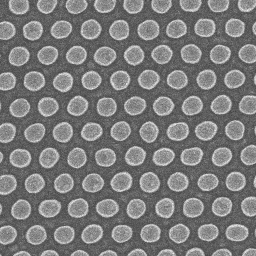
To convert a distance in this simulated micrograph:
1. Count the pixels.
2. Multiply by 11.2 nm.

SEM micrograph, a regular array of raised bodies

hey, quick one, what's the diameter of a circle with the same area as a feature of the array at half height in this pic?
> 210 nm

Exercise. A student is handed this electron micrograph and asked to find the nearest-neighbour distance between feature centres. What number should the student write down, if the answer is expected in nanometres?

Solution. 317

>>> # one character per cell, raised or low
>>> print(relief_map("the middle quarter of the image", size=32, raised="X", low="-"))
--------------------------------
--------------------------------
X-----XX----XXXX---XXXX----XXX--
XX---XXXX---XXXX---XXXXX--XXXXX-
XX---XXXX---XXXX---XXXX---XXXXX-
XX---XXX----XXXX---XXX-----XXX--
X-------------------------------
--------------------------------
--XXX------------X------XX-----X
--XXXX---XXXX---XXXX---XXXX---XX
-XXXXX---XXXX--XXXXX---XXXX---XX
-XXXX----XXXX---XXXX---XXXX---XX
--XX-----XXX----XX------XX-----X
--------------------------------
--------------X-----------------
XX---XXXX---XXXX----XXX----XXXX-
XX---XXXXX--XXXXX--XXXX---XXXXX-
XX---XXXX---XXXX---XXXX---XXXXX-
X----XXX----XXX-----XXX----XXX--
--------------------------------
--------------------------------
--XX------XX----XXXX----XX-----X
-XXXX---XXXXX---XXXX---XXXX---XX
-XXXX---XXXXX--XXXXX---XXXX---XX
-XXXX---XXXXX---XXXX---XXX----XX
--XX----------------------------
--------------------------------
--------------XX-----X-----XX---
XX---XXXX---XXXXX--XXXX----XXXX-
XX---XXXXX--XXXXX--XXXXX--XXXXX-
XX---XXXXX--XXXX---XXXXX--XXXXX-
X----XXXX----XX-----XXX-----X---